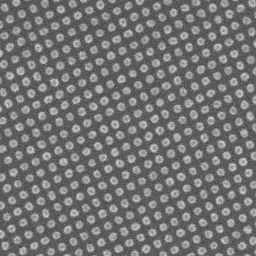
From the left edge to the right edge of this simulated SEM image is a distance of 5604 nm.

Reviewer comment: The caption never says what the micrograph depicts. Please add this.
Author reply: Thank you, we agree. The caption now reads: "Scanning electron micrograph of a regular array of raised bodies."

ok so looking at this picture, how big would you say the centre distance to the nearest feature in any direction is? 266 nanometres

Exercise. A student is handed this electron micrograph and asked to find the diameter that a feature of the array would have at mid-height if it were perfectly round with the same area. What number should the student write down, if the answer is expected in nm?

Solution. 144